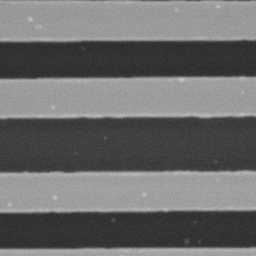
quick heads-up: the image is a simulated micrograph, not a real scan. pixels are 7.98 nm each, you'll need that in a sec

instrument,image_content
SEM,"lines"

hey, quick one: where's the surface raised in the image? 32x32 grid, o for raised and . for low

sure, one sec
oooooooooooooooooooooooooooooooo
oooooooooooooooooooooooooooooooo
oooooooooooooooooooooooooooooooo
oooooooooooooooooooooooooooooooo
oooooooooooooooooooooooooooooooo
................................
................................
................................
................................
................................
oooooooooooooooooooooooooooooooo
oooooooooooooooooooooooooooooooo
oooooooooooooooooooooooooooooooo
oooooooooooooooooooooooooooooooo
ooooooooooooooooooooooooooooooo.
................................
................................
................................
................................
................................
................................
....................o.ooo...oooo
oooooooooooooooooooooooooooooooo
oooooooooooooooooooooooooooooooo
oooooooooooooooooooooooooooooooo
oooooooooooooooooooooooooooooooo
oooooo.oo.......................
................................
................................
................................
................................
oooooooooooooooooooooooooooooooo